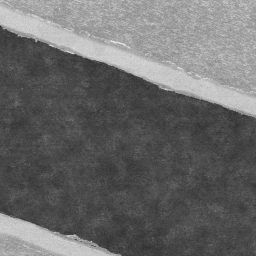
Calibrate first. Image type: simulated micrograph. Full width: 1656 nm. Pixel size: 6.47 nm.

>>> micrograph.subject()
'one or a few lines or trenches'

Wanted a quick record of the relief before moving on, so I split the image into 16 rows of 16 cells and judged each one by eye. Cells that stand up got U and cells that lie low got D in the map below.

UUUUUUUUUUUUUUUU
DDUUUUUUUUUUUUUU
DDDDUUUUUUUUUUUU
DDDDDDDUUUUUUUUU
DDDDDDDDDDUUUUUU
DDDDDDDDDDDDDUUU
DDDDDDDDDDDDDDDU
DDDDDDDDDDDDDDDD
DDDDDDDDDDDDDDDD
DDDDDDDDDDDDDDDD
DDDDDDDDDDDDDDDD
DDDDDDDDDDDDDDDD
DDDDDDDDDDDDDDDD
DDDDDDDDDDDDDDDD
UUDDDDDDDDDDDDDD
UUUUDDDDDDDDDDDD